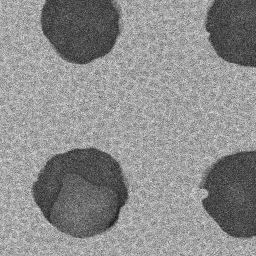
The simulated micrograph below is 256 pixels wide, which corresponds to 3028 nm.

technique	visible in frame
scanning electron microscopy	holes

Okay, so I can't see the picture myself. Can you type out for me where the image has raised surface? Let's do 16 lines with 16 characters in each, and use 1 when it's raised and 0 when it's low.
1110000111111000
1110000111111000
1110000111111000
1111001111111100
1111111111111111
1111111111111111
1111111111111111
1111111111111111
1111111111111111
1111001111111110
1110000011111000
1100000011111000
1100000011111000
1110000111111000
1111001111111100
1111111111111111